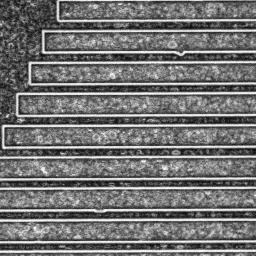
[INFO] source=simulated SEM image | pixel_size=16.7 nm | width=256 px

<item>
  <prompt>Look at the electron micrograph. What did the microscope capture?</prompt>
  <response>parallel lines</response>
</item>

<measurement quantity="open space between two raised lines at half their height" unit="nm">351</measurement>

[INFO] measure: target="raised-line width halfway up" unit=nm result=167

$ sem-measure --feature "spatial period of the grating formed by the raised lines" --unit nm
526